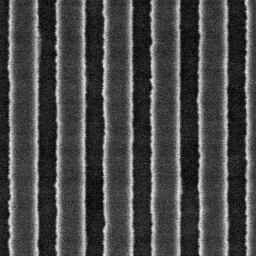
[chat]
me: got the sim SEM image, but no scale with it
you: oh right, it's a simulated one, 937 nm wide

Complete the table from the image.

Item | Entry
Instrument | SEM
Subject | lines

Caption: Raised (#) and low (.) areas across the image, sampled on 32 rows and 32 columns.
.####..####..###...###...###...#
.####..####..###...###...###...#
.####..####..###...###...###...#
.####..####..###...###...###...#
.####..####..###...###...###...#
.####..####..###...###...###...#
.####..####..###...###...###...#
.####..####..###...###...###...#
.####..####..###...###...###...#
.####..####..###...###...###...#
.####..####..###...###...###...#
.####..####..###...###...###...#
.####..####..###...###...###...#
.####..####..####..###...###...#
.####..####..####..###...###...#
.####..####..###...###...###...#
.####..####..####..###...###...#
.####..####..####..###...###...#
.####..####..###...###...###...#
.####..####..####..###...###...#
.####..####..###...###...###...#
.####..####..####..###...###...#
.####..####..####..###...###...#
.####..####..####..###...###...#
.####..####..####..###...###...#
.####..####..###...###...###...#
.####..####..####..####..###...#
.####..####..###...###...###...#
.####..####..####..###...###...#
.####..####..####..###...###...#
.####..####..####..###...###...#
.####..####..####..###...###...#